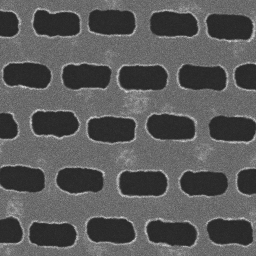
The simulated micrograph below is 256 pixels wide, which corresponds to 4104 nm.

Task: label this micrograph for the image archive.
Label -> a regular array of holes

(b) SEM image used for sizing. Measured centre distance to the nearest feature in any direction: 904 nanometres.